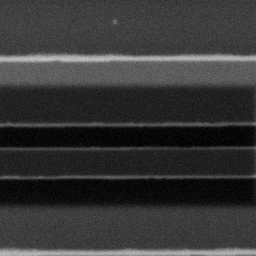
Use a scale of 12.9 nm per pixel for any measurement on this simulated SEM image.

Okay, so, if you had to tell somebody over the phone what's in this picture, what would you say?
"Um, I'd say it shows lines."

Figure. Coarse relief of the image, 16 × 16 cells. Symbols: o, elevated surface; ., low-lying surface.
................
................
................
................
oooooooooooooooo
oooooooooooooooo
oooooooooooooooo
oooooooooooooooo
oooooooooooooooo
oooooooooooooooo
oooooooooooooooo
................
................
................
................
................